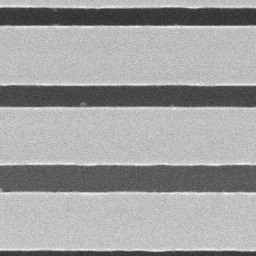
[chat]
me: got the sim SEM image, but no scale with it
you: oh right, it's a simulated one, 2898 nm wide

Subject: lines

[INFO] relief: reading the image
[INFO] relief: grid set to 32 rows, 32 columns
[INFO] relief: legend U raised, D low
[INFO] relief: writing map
UUUUUUUUUUUUUUUUUUUUUUUUUUUUUUUU
DDDDDDDDDDDDDDDDDDDDDDDDDDDDDDDD
DDDDDDDDDDDDDDDDDDDDDDDDDDDDDDDD
UUUUUUUUUUUUUUUUUUUUUUUUUUUUUUUU
UUUUUUUUUUUUUUUUUUUUUUUUUUUUUUUU
UUUUUUUUUUUUUUUUUUUUUUUUUUUUUUUU
UUUUUUUUUUUUUUUUUUUUUUUUUUUUUUUU
UUUUUUUUUUUUUUUUUUUUUUUUUUUUUUUU
UUUUUUUUUUUUUUUUUUUUUUUUUUUUUUUU
UUUUUUUUUUUUUUUUUUUUUUUUUUUUUUUU
UUUUUUUUUUUUUUUUUUUUUUUUUUUUUUUU
DDDDDDDDDDDDDDDDDDDDDDDDDDDDDDDD
DDDDDDDDDDDDDDDDDDDDDDDDDDDDDDDD
UDDDDDUUUDDUUUDUUUUUUDDDUDUDUDDD
UUUUUUUUUUUUUUUUUUUUUUUUUUUUUUUU
UUUUUUUUUUUUUUUUUUUUUUUUUUUUUUUU
UUUUUUUUUUUUUUUUUUUUUUUUUUUUUUUU
UUUUUUUUUUUUUUUUUUUUUUUUUUUUUUUU
UUUUUUUUUUUUUUUUUUUUUUUUUUUUUUUU
UUUUUUUUUUUUUUUUUUUUUUUUUUUUUUUU
UUUUUUUUUUUUUUUUUUUUUUUUUUUUUUUU
DDDDDDDDDDDDDDDDDDDDDDDDDDDDDDDD
DDDDDDDDDDDDDDDDDDDDDDDDDDDDDDDD
DDDDDDDDDDDDDDDDDDDDDDDDDDDDDDDD
UUUUUUUUUUUUUUUUUUUUUUUUUUUUUUUU
UUUUUUUUUUUUUUUUUUUUUUUUUUUUUUUU
UUUUUUUUUUUUUUUUUUUUUUUUUUUUUUUU
UUUUUUUUUUUUUUUUUUUUUUUUUUUUUUUU
UUUUUUUUUUUUUUUUUUUUUUUUUUUUUUUU
UUUUUUUUUUUUUUUUUUUUUUUUUUUUUUUU
UUUUUUUUUUUUUUUUUUUUUUUUUUUUUUUU
DDDDDDDDDDDDDDDDDDDDDDDDDDDDDDDD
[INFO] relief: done